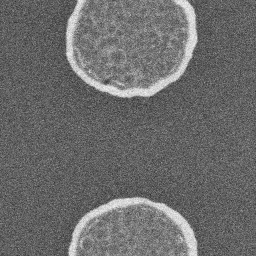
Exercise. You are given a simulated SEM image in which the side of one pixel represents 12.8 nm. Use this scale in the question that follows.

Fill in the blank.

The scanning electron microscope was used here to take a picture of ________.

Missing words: raised bodies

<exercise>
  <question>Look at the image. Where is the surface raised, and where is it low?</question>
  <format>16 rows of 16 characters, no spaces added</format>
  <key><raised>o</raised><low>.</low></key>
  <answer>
.....ooooooo....
....oooooooo....
....oooooooo....
....oooooooo....
.....oooooo.....
......oooo......
................
................
................
................
................
................
................
......ooooo.....
.....ooooooo....
.....ooooooo....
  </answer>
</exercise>